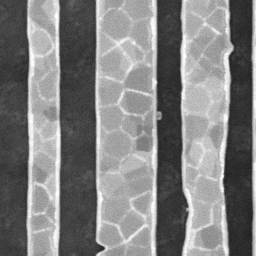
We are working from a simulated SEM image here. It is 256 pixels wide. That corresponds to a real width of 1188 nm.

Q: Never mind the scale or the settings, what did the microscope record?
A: one or a few lines or trenches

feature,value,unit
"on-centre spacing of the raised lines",374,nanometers